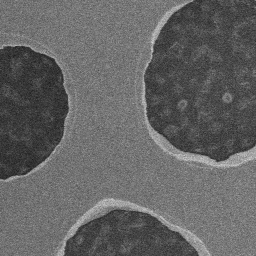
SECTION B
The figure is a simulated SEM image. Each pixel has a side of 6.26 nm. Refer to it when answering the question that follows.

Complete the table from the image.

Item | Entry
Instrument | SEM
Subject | holes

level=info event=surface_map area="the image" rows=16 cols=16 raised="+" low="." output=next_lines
+++++++++++.....
++++++++++......
++++++++++......
...++++++.......
....+++++.......
....+++++.......
....+++++.......
....+++++.......
....++++++......
...++++++++.....
..++++++++++++++
++++++++++++++++
++++++++++++++++
++++++....++++++
+++++.......++++
++++.........+++